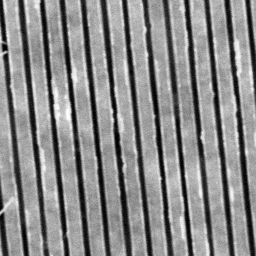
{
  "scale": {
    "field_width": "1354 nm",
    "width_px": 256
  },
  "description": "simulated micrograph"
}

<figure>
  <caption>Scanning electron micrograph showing parallel lines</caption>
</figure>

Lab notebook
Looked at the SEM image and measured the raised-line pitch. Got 108 nm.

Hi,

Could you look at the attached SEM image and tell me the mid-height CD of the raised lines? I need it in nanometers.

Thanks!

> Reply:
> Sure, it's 75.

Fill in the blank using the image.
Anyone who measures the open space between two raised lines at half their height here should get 0.0349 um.